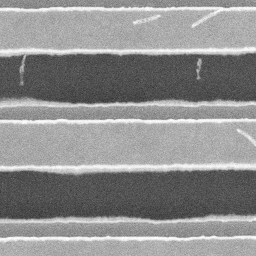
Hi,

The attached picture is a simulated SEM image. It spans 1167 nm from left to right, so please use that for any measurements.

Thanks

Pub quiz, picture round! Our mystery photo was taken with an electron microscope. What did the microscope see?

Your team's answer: lines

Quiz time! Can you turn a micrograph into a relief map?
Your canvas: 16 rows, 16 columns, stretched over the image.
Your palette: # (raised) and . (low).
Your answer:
################
################
################
................
................
................
................
################
################
################
###########.....
................
................
................
################
################